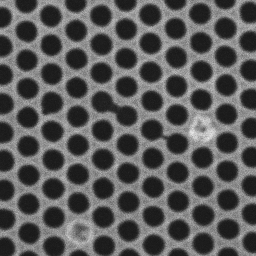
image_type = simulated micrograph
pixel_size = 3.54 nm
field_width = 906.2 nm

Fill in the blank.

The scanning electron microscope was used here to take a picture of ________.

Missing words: a regular array of holes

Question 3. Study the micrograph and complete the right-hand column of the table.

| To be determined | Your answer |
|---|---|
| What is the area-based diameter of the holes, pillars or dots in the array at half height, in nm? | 75.2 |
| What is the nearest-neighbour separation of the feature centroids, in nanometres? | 100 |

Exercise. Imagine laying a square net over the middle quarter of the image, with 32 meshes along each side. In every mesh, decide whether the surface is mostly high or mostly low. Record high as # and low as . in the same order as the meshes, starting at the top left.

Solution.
#....##....###....##....###...##
#######.....#######.....########
#######.....#######.....########
##..###.....##...##.....##....##
#....###...##.....###..###.....#
......#######.....#######......#
#.....#######.....########.....#
#.....##...###....##....##....##
###.###.....#######......#######
#######.....#######......#######
###.###.......#.####.....##...##
#....###..........###...##.....#
#.....#######.....########.....#
#.....#######.....########.....#
#.....##...###....##....##....##
##..###.....###..##......#######
#######.....#######......#######
#######.....#######......##..###
#....###....##....##...........#
#.....#######......#######.....#
#.....#######......#######.....#
#.....###..###....###...##.....#
##...##.....###...##.....###.###
#######.....########.....#######
#######.....########.....###.###
##...###....##....##....##....##
#.....###.###......#######.....#
#.....#######......#######.....#
#.....###.####.....##...##.....#
##...###....###...##....####..##
#######.....########.....#######
#######.....########.....#######